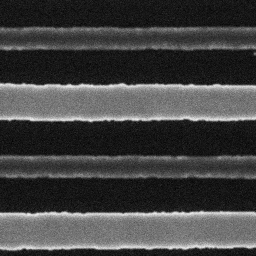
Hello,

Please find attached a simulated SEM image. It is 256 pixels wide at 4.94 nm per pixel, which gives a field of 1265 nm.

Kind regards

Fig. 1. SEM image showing lines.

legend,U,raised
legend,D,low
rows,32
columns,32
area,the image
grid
DDDDDDDDDDDDDDDDDDDDDDDDDDDDDDDD
DDDDDDDDDDDDDDDDDDDDDDDDDDDDDDDD
DDDDDDDDDDDDDDDDDDDDDDDDDDDDDDDD
DDDDDDDDDDDDDDDDDDDDDDDDDDDDDDDD
UUUUUUUUUUUUUUUUUUUUUUUUUUUUUUUU
UUUUUUUUUUUUUUUUUUUUUUUUUUUUUUUU
DDDDDDDDDDDDDDDDDDDDDDDDDDDDDDDD
DDDDDDDDDDDDDDDDDDDDDDDDDDDDDDDD
DDDDDDDDDDDDDDDDDDDDDDDDDDDDDDDD
DDDDDDDDDDDDDDDDDDDDDDDDDDDDDDDD
DDDDDDDDDDDDDDDDDDDDDDDDDDDDDDDD
UUUUUUUUUUUUUUUUUUUUUUUUUUUUUUUU
UUUUUUUUUUUUUUUUUUUUUUUUUUUUUUUU
UUUUUUUUUUUUUUUUUUUUUUUUUUUUUUUU
UUUUUUUUUUUUUUUUUUUUUUUUUUUUUUUU
DDDDDDDDDDDDDDDDDDDDDDDDDDDDDDDD
DDDDDDDDDDDDDDDDDDDDDDDDDDDDDDDD
DDDDDDDDDDDDDDDDDDDDDDDDDDDDDDDD
DDDDDDDDDDDDDDDDDDDDDDDDDDDDDDDD
DDDDDDDDDDDDDDDDDDDDDDDDDDDDDDDD
UUUUUUUUUUUUUUUUUUUUUUUUUUUUUUUU
UUUUUUUUUUUUUUUUUUUUUUUUUUUUUUUU
DDDDDDDDDDDDDDDDDDDDDDDDDDDDDDDD
DDDDDDDDDDDDDDDDDDDDDDDDDDDDDDDD
DDDDDDDDDDDDDDDDDDDDDDDDDDDDDDDD
DDDDDDDDDDDDDDDDDDDDDDDDDDDDDDDD
DDDDDDDDDDDDDDDDDDDDDDDDDUDUUDDD
UUUUUUUUUUUUUUUUUUUUUUUUUUUUUUUU
UUUUUUUUUUUUUUUUUUUUUUUUUUUUUUUU
UUUUUUUUUUUUUUUUUUUUUUUUUUUUUUUU
UUUUUUUUUUUUUUUUUUUUUUUUUUUUUUUU
DDDDDDDDDDDDDDDDDDDDDDDDDDDDDDDD